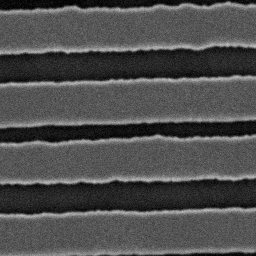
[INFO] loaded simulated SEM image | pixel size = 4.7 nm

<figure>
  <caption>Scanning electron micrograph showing lines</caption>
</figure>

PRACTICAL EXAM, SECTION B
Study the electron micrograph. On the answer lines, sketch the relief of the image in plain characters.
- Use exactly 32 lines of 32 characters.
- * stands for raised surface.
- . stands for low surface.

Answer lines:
.......................*...***..
********************************
********************************
********************************
********************************
********************************
*****...........................
................................
................................
.............................*.*
.*******************************
********************************
********************************
********************************
********************************
******.****.....................
................................
..........*.********************
********************************
********************************
********************************
********************************
**************.*********.....*..
................................
................................
................................
...........******.**************
********************************
********************************
********************************
********************************
*****************************.**